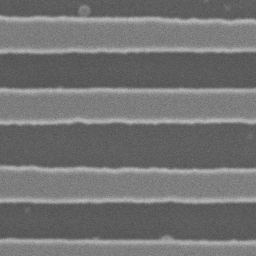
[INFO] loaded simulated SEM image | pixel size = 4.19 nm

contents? lines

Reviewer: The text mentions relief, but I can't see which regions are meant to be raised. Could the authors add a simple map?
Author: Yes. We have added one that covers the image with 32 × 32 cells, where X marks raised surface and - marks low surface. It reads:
--------------------------------
--------------------------------
XXXXXXXXXXXXXXXXXXXXXXXXXXXX-XXX
XXXXXXXXXXXXXXXXXXXXXXXXXXXXXXXX
XXXXXXXXXXXXXXXXXXXXXXXXXXXXXXXX
XXXXXXXXXXXXXXXXXXXXXXXXXXXXXXXX
XXXXXXXXXXXXXXXXXXX-----XX-XXX--
--------------------------------
--------------------------------
--------------------------------
--------------------------------
XXXXXXXXXXXXXXXXXXXXXXXXXXXXXXXX
XXXXXXXXXXXXXXXXXXXXXXXXXXXXXXXX
XXXXXXXXXXXXXXXXXXXXXXXXXXXXXXXX
XXXXXXXXXXXXXXXXXXXXXXXXXXXXXXXX
X-X-X---------------------------
--------------------------------
--------------------------------
--------------------------------
--------------------------------
--------------------------------
XXXXXXXXXXXXXXXXXXXXXXXXXXXXXXXX
XXXXXXXXXXXXXXXXXXXXXXXXXXXXXXXX
XXXXXXXXXXXXXXXXXXXXXXXXXXXXXXXX
XXXXXXXXXXXXXXXXXXXXXXXXXXXXXXXX
--------------------------------
--------------------------------
--------------------------------
--------------------------------
--------------------------------
XXXXXXXXXXXXXXXXXXXXXXXXXXXXXXXX
XXXXXXXXXXXXXXXXXXXXXXXXXXXXXXXX